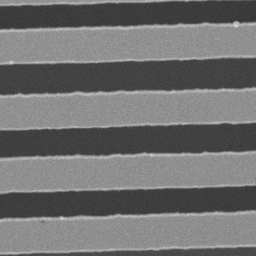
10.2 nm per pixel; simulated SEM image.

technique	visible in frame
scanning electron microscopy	lines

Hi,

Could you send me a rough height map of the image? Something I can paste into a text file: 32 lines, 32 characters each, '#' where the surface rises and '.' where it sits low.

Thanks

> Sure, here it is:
############....................
................................
................................
.......#########################
################################
################################
################################
#####################...........
................................
................................
................................
.........#..#.##################
################################
################################
################################
##########################......
................................
................................
................................
.........##..###################
################################
################################
################################
####################............
................................
................................
...........................#.###
################################
################################
################################
################################
#########.......................